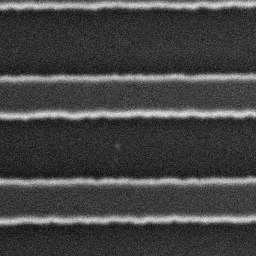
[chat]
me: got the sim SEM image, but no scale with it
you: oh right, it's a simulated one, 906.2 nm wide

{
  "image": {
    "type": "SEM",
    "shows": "lines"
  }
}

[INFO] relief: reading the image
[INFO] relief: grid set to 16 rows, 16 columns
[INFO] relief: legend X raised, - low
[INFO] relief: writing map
----------------
----------------
----------------
----------------
----------------
XXXXXXXXXXXXXXXX
XXXXXXXXXXXXXXXX
----------------
----------------
----------------
----------------
XXXXXXXXXXXXXXXX
XXXXXXXXXXXXXXXX
XXXXXXXXXXXXXXXX
----------------
----------------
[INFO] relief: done